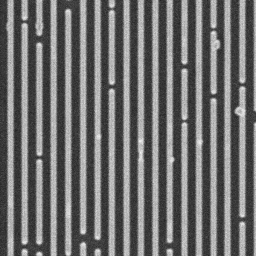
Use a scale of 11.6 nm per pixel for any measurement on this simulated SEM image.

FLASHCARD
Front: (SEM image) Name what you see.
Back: parallel lines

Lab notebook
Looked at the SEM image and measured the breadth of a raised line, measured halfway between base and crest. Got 52.4 nm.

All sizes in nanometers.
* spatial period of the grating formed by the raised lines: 169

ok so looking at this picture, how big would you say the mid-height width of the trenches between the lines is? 118 nm